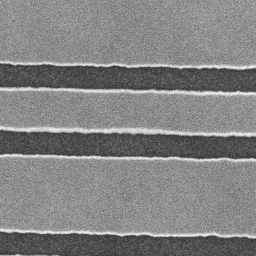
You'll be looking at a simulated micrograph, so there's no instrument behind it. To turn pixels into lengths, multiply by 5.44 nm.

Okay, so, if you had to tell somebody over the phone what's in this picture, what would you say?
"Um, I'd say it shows lines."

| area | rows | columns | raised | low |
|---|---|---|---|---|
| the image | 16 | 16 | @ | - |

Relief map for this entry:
@@@@@@@@@@@@@@@@
@@@@@@@@@@@@@@@@
@@@@@@@@@@@@@@@@
@@@@@@@@@@@@@@@@
----------------
-@--------------
@@@@@@@@@@@@@@@@
@@@@@@@@@@@@@@@@
----------------
----------------
@@@@@@@@@@@@@@@@
@@@@@@@@@@@@@@@@
@@@@@@@@@@@@@@@@
@@@@@@@@@@@@@@@@
@@@@@@@@@@@@@@@@
----------------